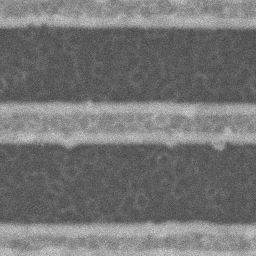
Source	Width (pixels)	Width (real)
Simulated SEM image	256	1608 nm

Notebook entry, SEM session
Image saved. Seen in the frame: one or a few lines or trenches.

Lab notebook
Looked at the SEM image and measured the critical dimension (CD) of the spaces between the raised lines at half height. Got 558 nm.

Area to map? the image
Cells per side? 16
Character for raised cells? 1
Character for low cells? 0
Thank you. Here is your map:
1111111111111111
0000000000000000
0000000000000000
0000000000000000
0000000000000000
0000000000000000
0000000000000000
1111111111111111
1111111111111111
0000000000000000
0000000000000000
0000000000000000
0000000000000000
0000000000000000
1111111111111111
1111111111111111